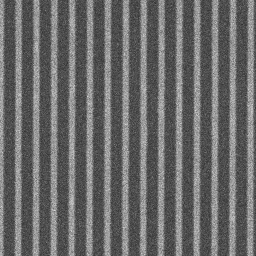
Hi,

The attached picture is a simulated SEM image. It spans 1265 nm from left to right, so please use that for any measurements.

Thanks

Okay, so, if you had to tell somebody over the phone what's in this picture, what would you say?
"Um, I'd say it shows parallel lines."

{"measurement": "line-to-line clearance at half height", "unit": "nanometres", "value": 58.1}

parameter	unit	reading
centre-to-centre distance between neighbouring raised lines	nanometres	88.3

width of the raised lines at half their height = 0.0296 µm